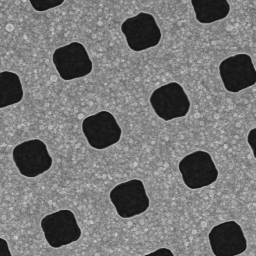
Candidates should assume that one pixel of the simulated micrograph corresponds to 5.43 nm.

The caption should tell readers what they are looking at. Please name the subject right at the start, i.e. a regular array of holes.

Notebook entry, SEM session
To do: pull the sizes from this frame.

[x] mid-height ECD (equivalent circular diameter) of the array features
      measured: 201 nm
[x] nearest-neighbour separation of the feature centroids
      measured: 403 nanometres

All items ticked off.